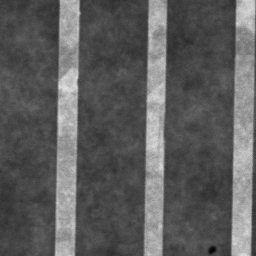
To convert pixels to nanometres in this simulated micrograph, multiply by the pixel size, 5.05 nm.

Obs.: one or a few lines or trenches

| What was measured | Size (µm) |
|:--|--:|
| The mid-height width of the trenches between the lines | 0.355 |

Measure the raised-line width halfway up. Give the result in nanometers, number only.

90.8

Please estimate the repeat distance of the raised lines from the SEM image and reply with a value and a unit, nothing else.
444 nanometers